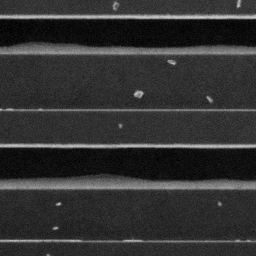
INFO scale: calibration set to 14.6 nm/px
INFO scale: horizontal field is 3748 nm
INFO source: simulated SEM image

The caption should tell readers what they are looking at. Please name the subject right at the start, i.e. lines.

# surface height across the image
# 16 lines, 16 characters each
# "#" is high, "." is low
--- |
################
................
................
################
################
################
################
################
################
................
................
................
################
################
################
################